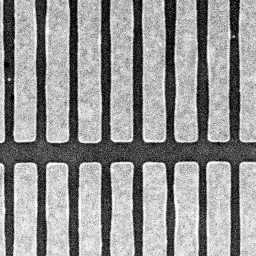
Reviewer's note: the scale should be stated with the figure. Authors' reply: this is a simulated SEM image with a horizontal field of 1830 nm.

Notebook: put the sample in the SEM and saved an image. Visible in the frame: groups of lines, slits or small figures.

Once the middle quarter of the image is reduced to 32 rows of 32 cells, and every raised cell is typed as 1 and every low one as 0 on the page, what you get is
10001111100011111000111110001111
10001111100011111000111110001111
10001111100011111000111110001111
10001111100011111000111110001111
10001111100011111000111110001111
10001111100011111000111110001111
10001111100011111000111110001111
10001111100011111000111110001111
10001111100011111000111110001111
10001111100011111000111110001111
10001111100011111000111110001111
10001111100011111000111110001111
10001111100011111000111110001111
10001111100011111000111110001111
10001111100011111000111110001111
10001111100011111000111110001111
10001111100011111000111110001111
10001111100011111000111110001111
10001111100011111000111110001111
00000000000000000000000000000000
00000000000000000000000000000000
00000000000000000000000000000000
00000000000000000000000000000000
00000000000000000000000000000000
00000000000000000000000000000000
10001111100011111000111110001111
10001111100011111000111110001111
10001111100011111000111110001111
10001111100011111000111110001111
10001111100011111000111110001111
10001111100011111000111110001111
10001111100011111000111110001111